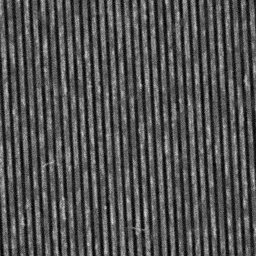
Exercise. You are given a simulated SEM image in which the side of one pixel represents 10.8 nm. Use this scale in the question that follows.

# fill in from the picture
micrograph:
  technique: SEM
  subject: parallel lines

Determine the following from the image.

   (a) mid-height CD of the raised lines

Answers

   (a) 41.6 nm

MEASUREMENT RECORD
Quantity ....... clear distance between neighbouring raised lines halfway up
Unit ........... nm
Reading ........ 47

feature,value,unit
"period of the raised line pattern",89.7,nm